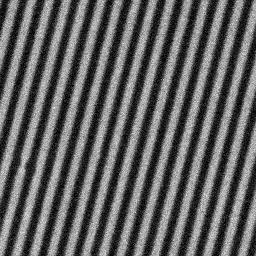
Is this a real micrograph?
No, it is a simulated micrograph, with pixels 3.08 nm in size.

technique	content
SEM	parallel lines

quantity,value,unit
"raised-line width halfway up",20.9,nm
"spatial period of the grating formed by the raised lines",51.6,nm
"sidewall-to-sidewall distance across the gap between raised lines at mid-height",29.4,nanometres